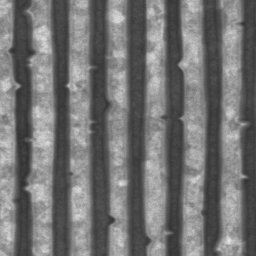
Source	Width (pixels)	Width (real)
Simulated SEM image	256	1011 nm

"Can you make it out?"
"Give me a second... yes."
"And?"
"parallel lines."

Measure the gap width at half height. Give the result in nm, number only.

61.8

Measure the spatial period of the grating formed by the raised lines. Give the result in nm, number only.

150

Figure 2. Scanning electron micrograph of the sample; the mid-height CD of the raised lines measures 0.0889 µm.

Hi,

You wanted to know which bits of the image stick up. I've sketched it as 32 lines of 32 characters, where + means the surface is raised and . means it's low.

++..++...++..+++..+++..++..+++..
++.++++..++..+++..+++..++..+++..
++..+++..++..+++..+++..++...++..
++..+++..++..+++..+++..++...++..
++..+++..++..+++..+++..+++..++..
+...+++..++..+++..+++..+++..++..
+...+++..++..+++..+++..+++..++..
++..+++..++..+++..+++..+++..++..
++..+++..++..+++..+++.++++..++..
++..+++..++..+++..+++..+++..++..
++..+++.+++..+++..+++..+++..++..
++..+++..++..+++..+++..+++..++..
++..+++..++...++..+++..+++..++..
++..+++..++...++..+++..+++..++..
++..+++..++..+++..+++..+++..++..
++..+++..++..+++..+++..+++..+++.
++..+++..++..+++..+++..+++..++..
++..+++..++..+++..+++..+++..++..
++..+++..++..+++..+++..+++..++..
++..+++..++...++..+++..+++..++..
++..+++..++...++..+++..+++..++..
++..+++..++...++..+++..+++..++..
++.+++...++...++..+++..+++.+++..
++.+++...++...++..+++..++..+++..
++..++...++...++..+++..++..+++..
++..++...+++..++..+++..++..+++..
++..++...+++..++..+++..++..+++..
++..++...+++..++..+++..++...++..
++..++...++...++..+++..++...++..
++..+++..++...++..+++..++..+++..
++..+++..++...++...++..++..+++..
++..+++..++..+++..+++..+++.+++..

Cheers